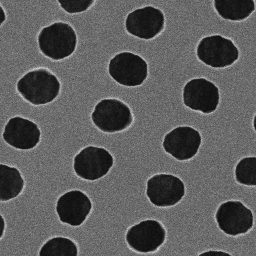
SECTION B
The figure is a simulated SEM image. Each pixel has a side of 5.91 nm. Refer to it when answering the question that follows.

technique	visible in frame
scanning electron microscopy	a regular array of holes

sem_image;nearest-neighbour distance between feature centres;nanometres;292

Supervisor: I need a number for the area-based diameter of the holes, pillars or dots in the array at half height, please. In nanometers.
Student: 207